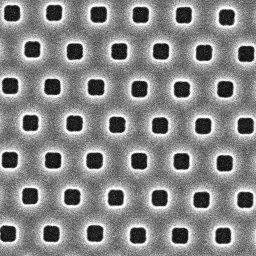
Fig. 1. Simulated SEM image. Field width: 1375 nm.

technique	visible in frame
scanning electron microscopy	a regular array of holes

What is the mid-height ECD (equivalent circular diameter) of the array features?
0.0994 micrometres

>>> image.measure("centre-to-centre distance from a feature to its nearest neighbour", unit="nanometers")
224